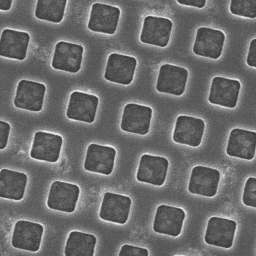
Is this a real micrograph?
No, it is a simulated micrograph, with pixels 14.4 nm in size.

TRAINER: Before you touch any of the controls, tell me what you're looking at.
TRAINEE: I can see a regular array of holes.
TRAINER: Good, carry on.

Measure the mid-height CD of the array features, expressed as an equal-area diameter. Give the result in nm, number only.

455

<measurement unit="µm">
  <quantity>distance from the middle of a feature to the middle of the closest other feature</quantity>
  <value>0.753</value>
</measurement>